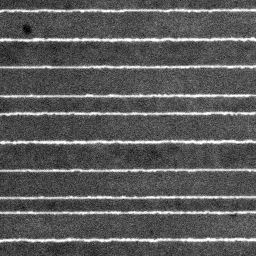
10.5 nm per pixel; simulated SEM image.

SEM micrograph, lines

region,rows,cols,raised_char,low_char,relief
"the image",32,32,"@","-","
@@@@@@@@@@@@@@@@@@@@@@@@@@@@@@@@
--------------------------------
--------------------------------
--------------------------------
--------------------------------
@@@@@@@@@@@@@@@@@@@@@@@@@@@@@@@@
@@@@@@@@@@@@@@@@@@@@@@@@@@@@@@@@
@@@@@@@@@@@@@@@@@@@@@@@@@@@@@@@@
--------------------------------
--------------------------------
--------------------------------
--------------------------------
@@@@@@@@@@@@@@@@@@@@@@@@@@@@@@@@
@@@@@@@@@@@@@@@@@@@@@@@@@@@@@@@@
--------------------------------
--------------------------------
--------------------------------
--------------------------------
@@@@@@@@@@@@@@@@@@@@@@@@@@@@@@@@
@@@@@@@@@@@@@@@@@@@@@@@@@@@@@@@@
@@@@@@@@@@@@@@@@@@@@@@@@@@@@@@@@
--------------------------------
--------------------------------
--------------------------------
--------------------------------
@@@@@@@@@@@@@@@@@@@@@@@@@@@@@@@@
@@@@@@@@@@@@@@@@@@@@@@@@@@@@@@@@
--------------------------------
--------------------------------
--------------------------------
@@@@@@@@@@@@@@@@@@@@@@@@@@@@@@@@
@@@@@@@@@@@@@@@@@@@@@@@@@@@@@@@@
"